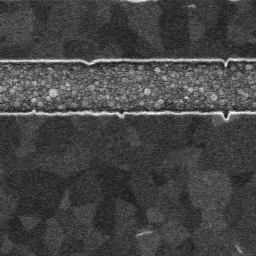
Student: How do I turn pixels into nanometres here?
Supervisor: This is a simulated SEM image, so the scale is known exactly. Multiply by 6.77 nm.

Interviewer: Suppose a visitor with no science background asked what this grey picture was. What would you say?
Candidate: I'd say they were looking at one or a few lines or trenches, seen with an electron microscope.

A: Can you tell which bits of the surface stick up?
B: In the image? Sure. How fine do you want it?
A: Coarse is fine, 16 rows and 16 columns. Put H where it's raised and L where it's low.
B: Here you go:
HHHHHHHHHHHHHHHH
HHHHHHHHHHHHHHHH
HHHHHHHHHHHHHHHH
HHHHHHHHHHHHHHHH
LLLLLLLLLLLLLLLL
LLLLLLLLLLLLLLLL
LLLLLLLLLLLLLLLL
HHHHHHHHHHHHHHHH
HHHHHHHHHHHHHHHH
HHHHHHHHHHHHHHHH
HHHHHHHHHHHHHHHH
HHHHHHHHHHHHHHHH
HHHHHHHHHHHHHHHH
HHHHHHHHHHHHHHHH
HHHHHHHHHHHHHHHH
HHHHHHHHHHHHHHHH